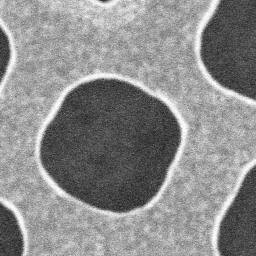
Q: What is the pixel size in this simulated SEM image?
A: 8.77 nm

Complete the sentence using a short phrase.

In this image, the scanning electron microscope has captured holes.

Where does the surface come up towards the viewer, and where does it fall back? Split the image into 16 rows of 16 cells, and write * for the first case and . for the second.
*************...
*************...
.***********....
.***********....
*************...
*****....*****..
****......******
***........*****
***........*****
**.........*****
***........*****
***.......*****.
*****.....****..
.*************..
.*************..
..************..